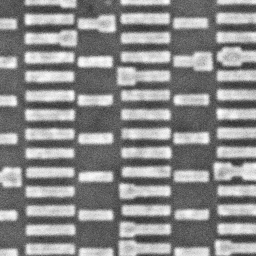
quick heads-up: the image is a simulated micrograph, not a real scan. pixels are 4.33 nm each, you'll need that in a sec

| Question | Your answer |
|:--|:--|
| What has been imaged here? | wiring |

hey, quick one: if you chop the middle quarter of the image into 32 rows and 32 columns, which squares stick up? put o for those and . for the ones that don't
.........ooo....................
..............oooo..............
oo............oooooooooooo......
oo............oooooooooooo......
..............oooo..............
................................
................................
oo.............ooooooooooo......
oo..oooooooo...ooooooooooo..oooo
....oooooooo................oooo
................................
................................
oo.............ooooooooooo......
oo.............ooooooooooo......
................................
................................
...............ooooooooooo......
oo.............ooooooooooo..oooo
....oooooooo................oooo
....oooooooo................oooo
................................
...............ooooooooooo......
oo.............oooooooooooo.....
................................
................................
................................
oo.............ooooooooooo......
oo..oooooooo...ooooooooooo..oooo
....oooooooo................oooo
................................
..............oooo..............
oo............oooooooooooo......